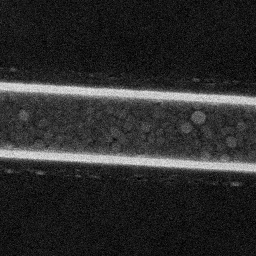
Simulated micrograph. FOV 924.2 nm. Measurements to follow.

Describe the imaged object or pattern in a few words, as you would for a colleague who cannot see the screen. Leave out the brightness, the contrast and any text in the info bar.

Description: one or a few lines or trenches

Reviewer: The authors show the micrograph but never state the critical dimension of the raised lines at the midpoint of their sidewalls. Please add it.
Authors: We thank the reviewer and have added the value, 0.248 microns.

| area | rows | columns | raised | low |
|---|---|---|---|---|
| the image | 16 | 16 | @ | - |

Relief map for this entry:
----------------
----------------
----------------
----------------
----------------
@@@-------------
@@@@@@@@@@@@@@@@
@@@@@@@@@@@@@@@@
@@@@@@@@@@@@@@@@
@@@@@@@@@@@@@@@@
---------------@
----------------
----------------
----------------
----------------
----------------